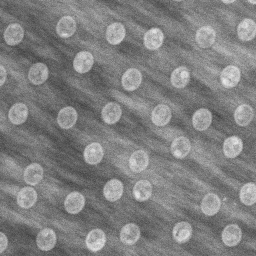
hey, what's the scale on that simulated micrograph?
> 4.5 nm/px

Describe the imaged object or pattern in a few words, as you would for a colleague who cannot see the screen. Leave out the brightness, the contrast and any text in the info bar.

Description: a regular array of raised bodies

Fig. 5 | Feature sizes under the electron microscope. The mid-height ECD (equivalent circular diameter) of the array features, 19.5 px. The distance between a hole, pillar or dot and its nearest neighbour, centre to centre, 173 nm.